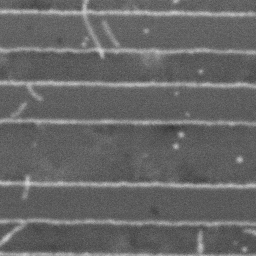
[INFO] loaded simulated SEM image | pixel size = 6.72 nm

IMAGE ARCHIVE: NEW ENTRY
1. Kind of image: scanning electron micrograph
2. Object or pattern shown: lines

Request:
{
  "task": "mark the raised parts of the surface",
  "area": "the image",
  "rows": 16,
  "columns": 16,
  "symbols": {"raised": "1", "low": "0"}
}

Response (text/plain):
0000000000000000
1111111111111111
1111111111111111
0000000000000000
0000000000000000
1111111111111111
1111111111111111
1111111111111111
0000000000000000
0000000000000000
0000000000000000
1111110100000000
1111111111111111
1111111111111111
0000000000000000
0000000000000000